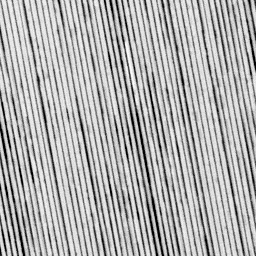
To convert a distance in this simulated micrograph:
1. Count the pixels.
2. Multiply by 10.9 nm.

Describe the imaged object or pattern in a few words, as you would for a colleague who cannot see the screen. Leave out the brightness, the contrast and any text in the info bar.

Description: parallel lines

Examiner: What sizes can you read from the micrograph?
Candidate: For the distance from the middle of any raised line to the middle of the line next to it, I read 5.69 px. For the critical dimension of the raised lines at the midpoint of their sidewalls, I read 30.8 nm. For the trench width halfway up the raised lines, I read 30.8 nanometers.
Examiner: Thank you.